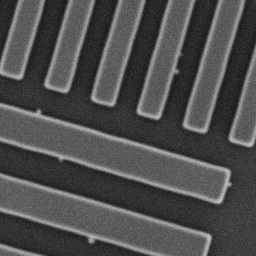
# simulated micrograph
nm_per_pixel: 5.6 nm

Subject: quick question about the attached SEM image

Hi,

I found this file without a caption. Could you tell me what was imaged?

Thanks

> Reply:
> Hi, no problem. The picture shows groups of lines, slits or small figures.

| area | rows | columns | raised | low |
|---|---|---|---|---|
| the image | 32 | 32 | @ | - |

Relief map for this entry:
--@@@----@@@---@@@---@@@---@@@--
--@@@---@@@----@@@---@@@---@@@--
--@@@---@@@---@@@---@@@@---@@@--
-@@@@---@@@---@@@---@@@---@@@@--
-@@@---@@@----@@@---@@@---@@@---
-@@@---@@@---@@@----@@@---@@@---
-@@@---@@@---@@@---@@@----@@@---
@@@----@@@---@@@---@@@---@@@----
@@@---@@@---@@@@---@@@---@@@---@
-@@---@@@---@@@---@@@----@@@---@
------@@@---@@@---@@@---@@@@---@
------------@@@---@@@---@@@---@@
------------@@----@@@---@@@---@@
@@---------------@@@----@@@---@@
@@@@@-------------@@---@@@----@@
@@@@@@@@@--------------@@@---@@@
@@@@@@@@@@@@-----------------@@@
@@@@@@@@@@@@@@@--------------@@@
---@@@@@@@@@@@@@@@@-------------
-------@@@@@@@@@@@@@@@----------
-----------@@@@@@@@@@@@@@@------
--------------@@@@@@@@@@@@@@----
@@---------------@@@@@@@@@@@@---
@@@@@@---------------@@@@@@@----
@@@@@@@@@---------------@@@@----
@@@@@@@@@@@@@-------------------
-@@@@@@@@@@@@@@@----------------
----@@@@@@@@@@@@@@@-------------
--------@@@@@@@@@@@@@@@---------
-----------@@@@@@@@@@@@@@@------
---------------@@@@@@@@@@@------
@@@---------------@@@@@@@@------